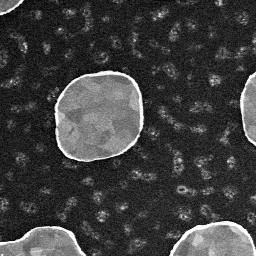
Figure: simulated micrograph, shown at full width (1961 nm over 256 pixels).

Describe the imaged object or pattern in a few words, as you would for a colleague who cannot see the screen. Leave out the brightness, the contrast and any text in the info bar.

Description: raised bodies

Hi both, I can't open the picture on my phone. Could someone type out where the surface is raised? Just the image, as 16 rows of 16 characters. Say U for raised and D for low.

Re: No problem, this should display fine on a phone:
UDDDDDDDDDDDDDDD
DDDDDDDDDDDDDDDD
DDDDDDDDDDDDDDDD
DDDDDDDDDDDDDDDD
DDDDDDDDDDDDDDDD
DDDDUUUUUDDDDDDU
DDDDUUUUUDDDDDDU
DDDDUUUUUDDDDDDU
DDDDUUUUUDDDDDDU
DDDDUUUUDDDDDDDD
DDDDDDDDDDDDDDDD
DDDDDDDDDDDDDDDD
DDDDDDDDDDDDDDDD
DDDDDDDDDDDDDDDD
DDUUDDDDDDDDUUUD
UUUUUDDDDDDUUUUU